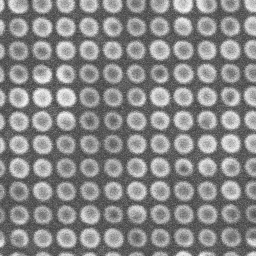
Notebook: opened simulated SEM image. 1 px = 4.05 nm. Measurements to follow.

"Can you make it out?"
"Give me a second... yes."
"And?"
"a regular array of raised bodies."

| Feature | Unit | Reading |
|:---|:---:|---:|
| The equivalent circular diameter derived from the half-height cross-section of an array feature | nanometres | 67.6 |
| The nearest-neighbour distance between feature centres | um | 0.0944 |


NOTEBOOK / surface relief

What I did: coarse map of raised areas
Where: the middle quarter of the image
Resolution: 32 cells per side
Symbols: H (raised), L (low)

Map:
HLLLLHHLLLLHHLLLLLLLLLLLLLLLLHLL
HHLLHHHHLLHHHHLLHHHHLLHHHHLLHHHH
HHHLHHHHLLHHHHLLHHHHLLHHHHLLHHHH
HHLLHHHHLLLHHHLLLHHHLLHHHHLLHHHH
HLLLLLLLLLLLLLLLLLLLLLLLLLLLLLLL
LLLLLLLLLLLLLLLLLLLLLLLLLLLLLLLL
HLLLLHHLLLLHHLLLLHHLLLLHHLLLLHHL
HHLLHHHHLLHHHHLLHHHHLLHHHHLLHHHH
HHHLHHHHHLHHHHLLHHHHLLHHHHLLHHHH
HHLLLHHHLLLHHHLLLHHHLLHHHHLLHHHH
LLLLLLLLLLLLLLLLLLLLLLLLLLLLLLLL
LLLLLLLLLLLLLLLLLLLLLLLLLLLLLLLL
HLLLLHHLLLLHHLLLLHHLLLLHHLLLLHHL
HHLLHHHHLLHHHHLLHHHHLLHHHHLLHHHH
HHHLHHHHLLHHHHLLHHHHLLHHHHLLHHHH
HHLLLHHHLLLHHHLLLHHHLLLHHHLLHHHH
LLLLLLLLLLLLLLLLLLLLLLLLLLLLLLLL
LLLLLLLLLLLLLLLLLLLLLLLLLLLLLLLL
HHLLLHHLLLLHHLLLLHHLLLHHHLLLLHHL
HHLLLHHHLLLHHHLLHHHHLLHHHHLLHHHH
HHLLLHHHLLLHHHLLHHHHLLHHHHLLHHHH
HHLLLHHHLLLHHHLLLHHHLLLHHLLLLHHL
LLLLLLLLLLLLLLLLLLLLLLLLLLLLLLLL
LLLLLLLLLLLLLLLLLLLLLLLLLLLLLLLL
HHLLLHHHLLLHHHLLLHHLLLHHHLLLLHHL
HHLLLHHHLLHHHHLLHHHHLLHHHHLLHHHH
HHHLLHHHLLHHHHLLHHHHLLHHHHLLHHHH
HHLLLHHHLLLHHHLLLHHHLLLHHLLLLHHL
LLLLLLLLLLLLLLLLLLLLLLLLLLLLLLLL
LLLLLLLLLLLLLLLLLLLLLLLLLLLLLLLL
HHLLLHHHLLLHHHLLLHHHLLHHHLLLHHHL
HHLLLHHHLLLHHHLLHHHHLLHHHHLLHHHH